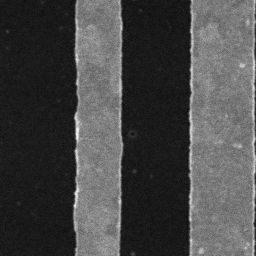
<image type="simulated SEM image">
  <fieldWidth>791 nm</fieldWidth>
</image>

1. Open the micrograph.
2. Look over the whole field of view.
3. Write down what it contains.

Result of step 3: one or a few lines or trenches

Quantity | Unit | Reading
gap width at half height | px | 70.1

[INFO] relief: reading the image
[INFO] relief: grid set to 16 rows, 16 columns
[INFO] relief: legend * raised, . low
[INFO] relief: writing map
.....***....****
.....***....****
.....***....****
.....***....****
.....***....****
.....***....****
.....***....****
.....***....****
.....***....****
.....***....****
.....***....****
.....***....****
.....***....****
.....**.....****
.....**.....****
.....**.....****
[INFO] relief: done